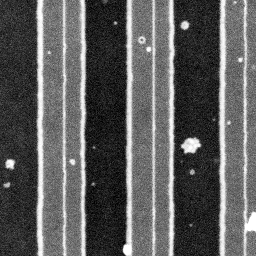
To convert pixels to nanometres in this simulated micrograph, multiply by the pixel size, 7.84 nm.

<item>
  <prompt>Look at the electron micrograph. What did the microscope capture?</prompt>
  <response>lines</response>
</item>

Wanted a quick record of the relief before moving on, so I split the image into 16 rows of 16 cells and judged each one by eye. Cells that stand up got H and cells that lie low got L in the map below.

LLLHHLLLHHHLLLHH
LLLHHLLLHHHLLLHH
LLLHHLLLHHHLLLHH
LLLHHLLLHHHLLLHH
LLLHHLLLHHHLLLHH
LLLHHLLLHHHLLLHH
LLLHHLLLHHHLLLHH
LLLHHLLLHHHLLLHH
LLLHHLLLHHHLLLHH
LLLHHLLLHHHLLLHH
LLLHHLLLHHHLLLHH
LLLHHLLLHHHLLLHH
LLLHHLLLHHHLLLHH
LLLHHLLLHHHLLLHH
LLLHHLLLHHHLLLHH
LLLHHLLLHHHLLLHH